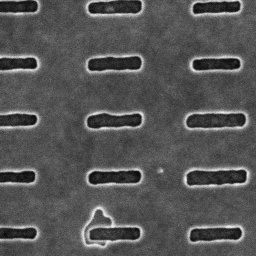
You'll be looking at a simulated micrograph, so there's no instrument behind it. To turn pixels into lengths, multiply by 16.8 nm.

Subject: a regular array of holes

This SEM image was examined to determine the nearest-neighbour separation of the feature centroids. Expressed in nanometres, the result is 949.